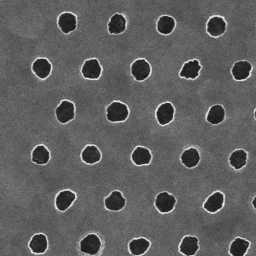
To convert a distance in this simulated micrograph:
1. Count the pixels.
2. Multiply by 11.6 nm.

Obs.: a regular array of holes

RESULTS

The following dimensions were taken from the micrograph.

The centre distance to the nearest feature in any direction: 572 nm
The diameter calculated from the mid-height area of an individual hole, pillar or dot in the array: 221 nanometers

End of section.